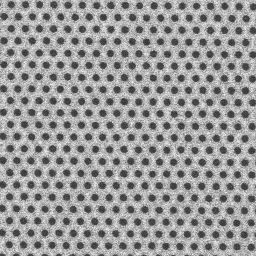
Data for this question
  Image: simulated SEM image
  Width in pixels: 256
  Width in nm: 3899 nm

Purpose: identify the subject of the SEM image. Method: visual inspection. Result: a regular array of holes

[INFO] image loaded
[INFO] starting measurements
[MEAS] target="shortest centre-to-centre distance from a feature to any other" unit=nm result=208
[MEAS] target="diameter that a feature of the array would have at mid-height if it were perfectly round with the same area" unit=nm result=115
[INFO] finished